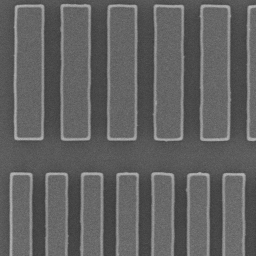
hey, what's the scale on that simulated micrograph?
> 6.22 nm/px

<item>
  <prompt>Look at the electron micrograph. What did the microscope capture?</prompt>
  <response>groups of lines, slits or small figures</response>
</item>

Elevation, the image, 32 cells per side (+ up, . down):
................................
..+++...+++...+++..++++..++++..+
..+++...+++...+++..++++..++++..+
..+++...+++...+++...+++..++++..+
..+++...+++...+++...+++..++++..+
..+++...+++...+++...+++..++++..+
..+++...+++...+++..++++..++++..+
..+++...+++...+++..++++..++++..+
..+++...+++...+++..++++..++++..+
..+++...+++...+++..++++..++++..+
..+++...+++...+++..++++..++++..+
..+++...+++...+++..++++..++++..+
..+++...+++...+++..++++..++++..+
..+++...+++...+++..++++..++++..+
..+++...+++...+++..++++..++++..+
..+++...+++...+++..++++..++++..+
..+++...+++...+++..++++..++++..+
................................
................................
................................
................................
................................
.+++..++..+++..++..+++..++..++..
.+++..++..+++..++..+++..++..++..
.+++..++..+++..++..+++..++..++..
.+++..++..+++..++..+++..++..++..
.+++..++..+++..++..+++..++..++..
.+++..++..+++..++..+++..++..++..
.+++..++..+++..++..+++..++..++..
.+++..++..+++..++..+++..++..++..
.+++..++..+++..++..+++..++..++..
.+++..++..+++..++..+++..++..++..